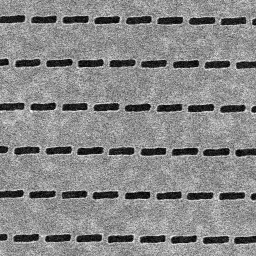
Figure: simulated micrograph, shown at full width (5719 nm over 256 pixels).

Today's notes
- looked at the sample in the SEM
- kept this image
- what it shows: a regular array of holes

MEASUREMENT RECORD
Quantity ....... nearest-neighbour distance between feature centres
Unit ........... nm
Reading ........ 704